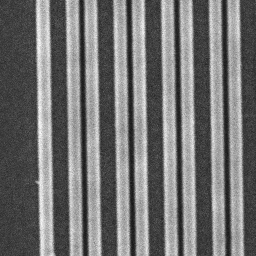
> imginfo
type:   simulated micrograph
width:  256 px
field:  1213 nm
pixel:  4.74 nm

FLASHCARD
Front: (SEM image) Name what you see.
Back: parallel lines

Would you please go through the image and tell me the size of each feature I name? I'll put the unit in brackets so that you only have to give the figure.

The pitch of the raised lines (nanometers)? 113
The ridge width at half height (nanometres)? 58.1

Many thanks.